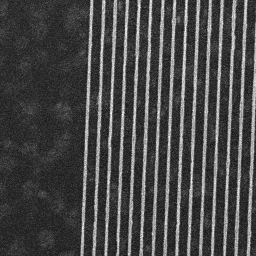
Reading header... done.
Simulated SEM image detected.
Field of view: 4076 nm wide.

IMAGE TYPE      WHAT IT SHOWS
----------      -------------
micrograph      parallel lines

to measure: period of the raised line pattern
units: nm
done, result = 189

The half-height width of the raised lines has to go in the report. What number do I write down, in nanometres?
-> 31.8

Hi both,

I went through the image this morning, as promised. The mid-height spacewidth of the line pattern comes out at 153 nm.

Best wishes